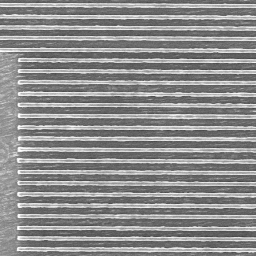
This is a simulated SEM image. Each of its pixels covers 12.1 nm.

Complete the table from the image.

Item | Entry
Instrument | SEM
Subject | parallel lines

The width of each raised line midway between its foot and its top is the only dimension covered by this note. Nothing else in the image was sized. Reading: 45.4 nm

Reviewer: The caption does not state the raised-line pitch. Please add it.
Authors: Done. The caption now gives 11.1 px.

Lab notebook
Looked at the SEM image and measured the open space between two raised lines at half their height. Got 90.7 nm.